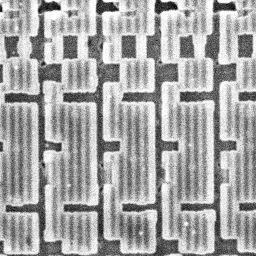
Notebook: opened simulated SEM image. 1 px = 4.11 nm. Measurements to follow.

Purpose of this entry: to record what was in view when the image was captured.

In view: wiring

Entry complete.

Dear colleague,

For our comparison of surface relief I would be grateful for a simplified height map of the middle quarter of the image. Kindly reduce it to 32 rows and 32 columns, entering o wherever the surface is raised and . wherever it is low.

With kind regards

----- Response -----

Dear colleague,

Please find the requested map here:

oooooooo......oooooooo.......ooo
oooooooo......oooooooo.......ooo
oooooooo......oooooooo.......ooo
oooooooo......oooooooo.......ooo
oooooooo......oooooooo.......ooo
oooooooo..oooooooooooo...ooooooo
oooooooo..oooooooooooo...ooooooo
..........ooooo..........oooo...
..........oooo...........oooo...
..........ooooo..........oooo...
oooooooo..ooooooooooooo..ooooooo
oooooooo..ooooooooooooo..ooooooo
oooooooo..ooooooooooooo..ooooooo
oooooooo..ooooooooooooo..ooooooo
oooooooo..ooooooooooooo..ooooooo
oooooooo..ooooooooooooo..ooooooo
oooooooo..ooooooooooooo..ooooooo
oooooooo..ooooooooooooo..ooooooo
oooooooo..ooooooooooooo..ooooooo
oooooooo......ooooooooo......ooo
oooooooo......ooooooooo......ooo
oooooooo......ooooooooo......ooo
oooooooo..ooooooooooooo..ooooooo
oooooooo..ooooooooooooo..ooooooo
oooooooo....ooooooooooo..ooooooo
oooooooo....ooooooooooo..ooooooo
oooooooo....ooooooooooo..ooooooo
oooooooo....ooooooooooo...oooooo
oooooooo....ooooooooooo...oooooo
oooooooo....ooooooooooo...oooooo
oooooooo..ooooooooooooo..ooooooo
oooooooo..ooooooooooooo..ooooooo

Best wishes